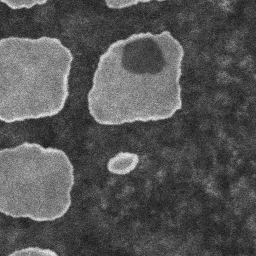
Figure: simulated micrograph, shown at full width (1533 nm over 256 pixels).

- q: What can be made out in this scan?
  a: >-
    raised bodies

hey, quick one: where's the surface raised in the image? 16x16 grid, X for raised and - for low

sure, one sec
----------------
----------------
XXX-----XXX-----
XXXX---XXXX-----
XXXX--XXXXX-----
XXXX--XXXXX-----
XXXX--XXXXX-----
X-----XXXX------
----------------
XXXX------------
XXXX---X--------
XXXXX-----------
XXXX------------
-XXX------------
----------------
----------------